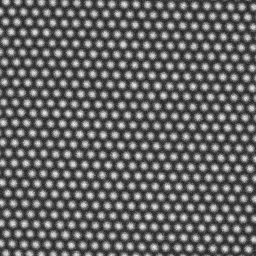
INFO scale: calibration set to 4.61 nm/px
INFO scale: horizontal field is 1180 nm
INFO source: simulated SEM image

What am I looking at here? a regular array of raised bodies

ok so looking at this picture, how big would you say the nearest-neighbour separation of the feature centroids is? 52.5 nm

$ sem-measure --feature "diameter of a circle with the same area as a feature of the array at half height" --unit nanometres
28.5